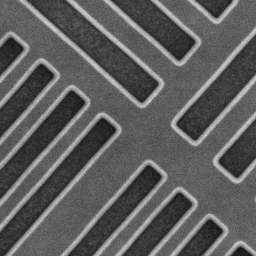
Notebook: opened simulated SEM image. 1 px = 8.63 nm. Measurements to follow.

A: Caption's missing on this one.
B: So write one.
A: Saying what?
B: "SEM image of groups of lines, slits or small figures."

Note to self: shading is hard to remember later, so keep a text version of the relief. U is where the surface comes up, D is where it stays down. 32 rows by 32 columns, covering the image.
UUUDDDDDDUUUUUDDDDDDUUUUUDDDDUUU
UUUUUDDDDDUUUUUDDDDDDUUUUUDDUUUU
UUUUUUDDDDDUUUUUDDDDDDUUUUUUUUUU
UUUUUUUDDDDDUUUUUDDDDDDUUUUUUUUU
UDUUUUUUDDDDDDUUUUUDDDDDUUUUUUUD
DDDUUUUUUDDDDDDUUUUUDDDDDUUUUUUD
DDDUUUUUUUDDDDDDUUUUUDDDUUUUUUDD
DDUUUUUUUUUDDDDDDUUUUUDUUUUUUDDD
DUUUDDUUUUUUDDDDDDUUUUUUUUUUDDDD
UUUDDDDUUUUUUDDDDDDUUUUUUUUDDDDD
UUDDDDUUUUUUUUUDDDDDUUUUUUDDDDDU
UUDDDUUUDDUUUUUUDDDUUUUUUDDDDDUU
UDDDDUUDDDDUUUUUUDDUUUUUDDDDDUUU
DDDDUUUDDDUUUUUUUUUUUUUDDDDDUUUU
DDDUUUDDDDUUUUUUUUUUUUDDDDDDUUUU
DDUUUDDDDUUUDDUUUUUUUUDDDDDUUUUD
DUUUDDDDUUUDDDDUUUUUUUUDDDUUUUDD
UUUDDDDUUUDDDDUUUUUUUUUUDUUUUDDD
UUDDDDUUUDDDDUUUUUUUUUUUUUUUDDDD
UDDDDUUUDDDDUUUUUUUUUUUUUUUDDDDD
DDDDUUUDDDDUUUUUUUDUUUUUUUUDDDDD
DDDUUUDDDDUUUUUUUDDDUUUUUUUUDDDU
DDUUUUDDDUUUUUUUDDDDUUUUUUUUUUUU
DDUUUDDDUUUUUUUUDDDUUUUUUUUUUUUU
DUUUDDDDUUUUUUUDDDDUUUDUUUUUUUUU
UUUDDDDUUUUUUUDDDDUUUDDDUUUUUUUU
UUDDDDUUUUUUUDDDDUUUDDDDUUUUUUUU
UDDDDUUUUUUUDDDDUUUDDDDUUUDUUUUU
DDDDUUUUUUUDDDDUUUDDDDUUUDDDUUUU
DDDUUUUUUUDDDDUUUDDDDUUUDDDDUUUU
DDUUUUUUUDDDDUUUDDDDUUUDDDDUUUUU
DUUUUUUUUDDDUUUDDDDUUUDDDDUUUDDU